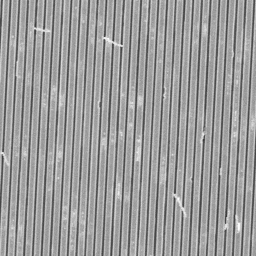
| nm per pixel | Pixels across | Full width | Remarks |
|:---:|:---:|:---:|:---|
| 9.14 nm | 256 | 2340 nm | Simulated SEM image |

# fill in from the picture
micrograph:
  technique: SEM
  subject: parallel lines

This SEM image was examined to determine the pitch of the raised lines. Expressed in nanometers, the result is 79.5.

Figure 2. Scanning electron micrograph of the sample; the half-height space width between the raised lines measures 24 nanometres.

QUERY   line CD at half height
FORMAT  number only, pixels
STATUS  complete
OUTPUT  6.25